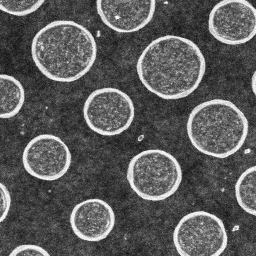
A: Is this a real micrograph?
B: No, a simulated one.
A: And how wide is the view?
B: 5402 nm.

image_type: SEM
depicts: raised bodies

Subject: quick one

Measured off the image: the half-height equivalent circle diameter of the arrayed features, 1020 nanometres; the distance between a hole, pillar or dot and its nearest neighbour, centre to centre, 1620 nm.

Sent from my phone